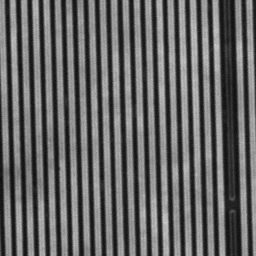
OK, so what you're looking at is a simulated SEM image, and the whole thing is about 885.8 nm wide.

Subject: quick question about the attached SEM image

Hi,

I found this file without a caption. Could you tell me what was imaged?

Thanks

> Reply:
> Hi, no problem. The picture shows parallel lines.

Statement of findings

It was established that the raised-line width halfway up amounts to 15.6 nanometers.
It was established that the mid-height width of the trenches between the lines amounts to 0.0247 um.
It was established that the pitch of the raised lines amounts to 39 nanometres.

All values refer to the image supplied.